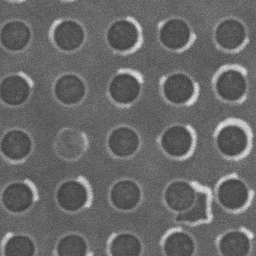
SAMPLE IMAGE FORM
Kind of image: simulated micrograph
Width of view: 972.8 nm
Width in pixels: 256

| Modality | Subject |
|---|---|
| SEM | a regular array of holes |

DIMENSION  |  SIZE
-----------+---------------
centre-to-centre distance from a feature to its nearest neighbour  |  53.2 pixels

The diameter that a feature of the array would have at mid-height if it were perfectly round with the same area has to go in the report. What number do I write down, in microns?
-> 0.117